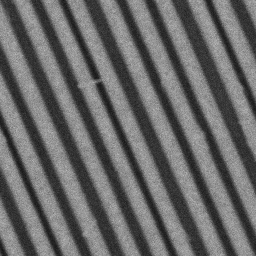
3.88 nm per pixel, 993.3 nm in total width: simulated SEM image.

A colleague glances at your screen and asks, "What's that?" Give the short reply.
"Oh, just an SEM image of parallel lines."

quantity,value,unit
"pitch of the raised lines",102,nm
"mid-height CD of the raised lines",0.0569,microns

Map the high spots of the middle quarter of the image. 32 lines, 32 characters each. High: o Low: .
..oooo..oooo....oooo...oooo...oo
..oooo..oooo....oooo...oooo...oo
...oooo..oooo....oooo...oooo...o
...oooo..oooo....oooo...oooo...o
....ooooooooo.....oooo..ooooo...
....oooo..oooo....oooo...oooo...
o...oooo..oooo.....oooo..ooooo..
o....oooo..oooo....oooo...oooo..
oo...oooo..oooo....oooo...oooo..
oo....oooo..oooo....oooo...oooo.
ooo...oooo..oooo....oooo...oooo.
ooo....oooo..oooo....oooo...oooo
oooo...oooo..oooo....oooo...oooo
.ooo....ooo..ooooo...ooooo..oooo
.oooo...oooo..oooo....oooo...ooo
.oooo...oooo..ooooo...oooo...ooo
..ooo....oooo..oooo....oooo...oo
..oooo...oooo..oooo....oooo...oo
..oooo....ooo...oooo....oooo...o
...oooo...oooo..oooo....oooo...o
...oooo....ooo...ooo.....oooo...
....oooo...oooo..oooo....oooo...
....oooo...oooo..ooooo...ooooo..
o....oooo...oooo..oooo....oooo..
o....oooo...oooo..oooo....oooo..
oo...oooo....ooo...oooo....oooo.
oo....oooo...oooo..oooo....oooo.
ooo...oooo....ooo...ooo.....oooo
ooo....oooo...oooo..oooo....oooo
ooo....oooo...oooo..oooo.....ooo
oooo....oooo...oooo..oooo....ooo
oooo....oooo...oooo..oooo.....oo